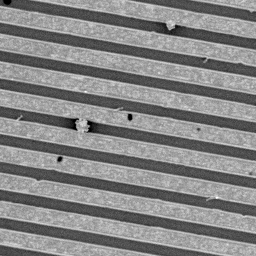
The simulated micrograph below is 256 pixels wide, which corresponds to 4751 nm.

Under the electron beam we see parallel lines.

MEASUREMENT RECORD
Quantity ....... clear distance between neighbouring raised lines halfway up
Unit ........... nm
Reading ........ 222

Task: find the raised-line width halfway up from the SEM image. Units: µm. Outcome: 0.286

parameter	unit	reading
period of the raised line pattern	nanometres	508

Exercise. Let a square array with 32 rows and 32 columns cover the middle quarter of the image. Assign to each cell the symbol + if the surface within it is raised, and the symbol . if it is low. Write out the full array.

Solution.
........+++++++++++++++++++++...
.............+++++++++++++++++++
+..................+++++++++++++
+++++++..................+++++++
++++++++++++...................+
++++++++++++++++++..............
..++++++++++++++++++++++........
........++++++++++++++++++++++..
..............++++++++++++++++++
+...................++++++++++++
+++++++.................++++++++
++++++++++++++.................+
+++++++++++++++++++.............
...++++++++++++++++++++++.......
...+++..++++++++++++++++++++++..
...+++........++++++++++++++++++
++.+++..............++++++++++++
++++++++..................++++++
+++++++++++++...................
+++++++++++++++++++.............
...++++++++++++++++++++++.......
.........++++++++++++++++++++++.
...............+++++++++++++++++
++..................++++++++++++
++++++++..................++++++
++++++++++++++..................
++++++++++++++++++++............
...++++++++++++++++++++++.......
.........++++++++++++++++++++++.
...............+++++++++++++++++
+++..................+++++++++++
++++++++...................+++++